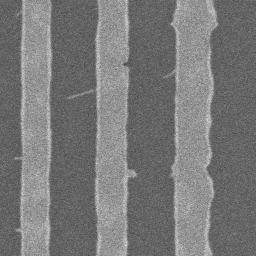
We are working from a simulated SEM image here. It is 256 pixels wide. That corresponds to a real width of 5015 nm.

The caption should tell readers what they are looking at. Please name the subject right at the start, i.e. one or a few lines or trenches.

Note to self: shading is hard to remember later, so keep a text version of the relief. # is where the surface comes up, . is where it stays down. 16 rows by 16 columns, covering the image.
.##...##...##...
.##...##...##...
.##...##...##...
.##...##...##...
.##...##...##...
.##...##...##...
.##...##...##...
.##...##...##...
.##...##...##...
.##...##...##...
.##...##...##...
.##...##...##...
.##...##...##...
.##...##...##...
.##...##...##...
.##...##...##...